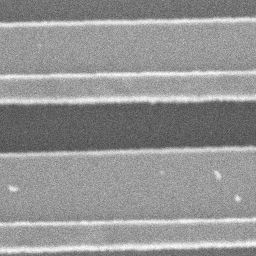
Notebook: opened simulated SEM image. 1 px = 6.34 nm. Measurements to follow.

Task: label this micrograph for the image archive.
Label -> lines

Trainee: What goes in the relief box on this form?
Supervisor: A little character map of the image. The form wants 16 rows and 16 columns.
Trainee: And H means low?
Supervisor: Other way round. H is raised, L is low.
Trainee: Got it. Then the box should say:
LLLLLLLLLLLLLLLL
LLHHHHHHHHHHHHHH
HHHHHHHHHHHHHHHH
HHHHHHHHHHHHHHHH
HHHHHHHHHHHHHHHH
HHHHHHHHHHHHHHHH
LLLLLLLLLLLLLLLL
LLLLLLLLLLLLLLLL
LLLLLLLLLLLLLLLL
LLLLLLLHHHHHHHHH
HHHHHHHHHHHHHHHH
HHHHHHHHHHHHHHHH
HHHHHHHHHHHHHHHH
HHHHHHHHHHHHHHHH
HHHHHHHHHHHHHHHH
HHHHHHHLLLLLLLLL